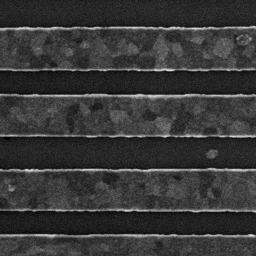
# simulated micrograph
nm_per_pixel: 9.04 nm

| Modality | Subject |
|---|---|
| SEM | lines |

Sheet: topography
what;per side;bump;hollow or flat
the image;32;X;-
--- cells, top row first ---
--------------------------------
--------------------------------
--------------------------------
-------X-XX--XXXXXX--X----X-XXXX
XXXXXXXXXXXXXXXXXXXXXXXXXXXXXXXX
XXXXXXXXXXXXXXXXXXXXXXXXXXXXXXXX
XXXXXXXXXXXXXXXXXXXXXXXXXXXXXXXX
XXXXXXXXXXXXXXXXXXXXXXXXXXXXXXXX
XXXXXXXXXXXXXXXXXXXXXXXXXXXXXXXX
--------------------------------
--------------------------------
--------------------------------
XXXXXXXXXXXXXXXXXXXXXXXXXXXXXXXX
XXXXXXXXXXXXXXXXXXXXXXXXXXXXXXXX
XXXXXXXXXXXXXXXXXXXXXXXXXXXXXXXX
XXXXXXXXXXXXXXXXXXXXXXXXXXXXXXXX
XXXXXXXXXXXXXXXXXXXXXXXXXXXXXXXX
--------------------------------
--------------------------------
--------------------------------
--------------------------------
XXXXXXXXXXXXXXXXXXXXXXXXXXXXXXXX
XXXXXXXXXXXXXXXXXXXXXXXXXXXXXXXX
XXXXXXXXXXXXXXXXXXXXXXXXXXXXXXXX
XXXXXXXXXXXXXXXXXXXXXXXXXXXXXXXX
XXXXXXXXXXXXXXXXXXXXXXXXXXXXXXXX
--------------------------------
--------------------------------
--------------------------------
XXXXXXXXXXXXXXXXXXXXXXXXXXXXXXXX
XXXXXXXXXXXXXXXXXXXXXXXXXXXXXXXX
XXXXXXXXXXXXXXXXXXXXXXXXXXXXXXXX